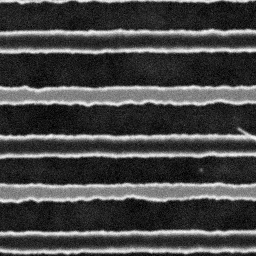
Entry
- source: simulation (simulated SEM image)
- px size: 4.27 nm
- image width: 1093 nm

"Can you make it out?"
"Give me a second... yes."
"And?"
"lines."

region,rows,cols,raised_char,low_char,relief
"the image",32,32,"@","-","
--------------------------------
--------------------------------
--------------------------------
--------------------------------
@@@@@@@@@@@@@@@@@@@@@@@@@@@@@@@@
@@@@@@@@@@@@@@@@@@@@@@@@@@@@@@@@
-@-------@@@@-------------------
--------------------------------
--------------------------------
--------------------------------
--------------------------------
@@@@@@@@@@@@@@@@@@@@@@@@@@@@@@@@
@@@@@@@@@@@@@@@@@@@@@@@@@@@@@@@@
--------------------------------
--------------------------------
--------------------------------
--------------------------------
@@@@@@@@@@@@@@@@@@@@@@@@@@@@@@@@
@@@@@@@@@@@@@@@@@@@@@@@@@@@@@@@@
@@@@@@-@@-----@@--@-----@-------
--------------------------------
--------------------------------
--------------------------------
@@@@@@@@@@@@@@@@@@@@@@@@@@@@@@@@
@@@@@@@@@@@@@@@@@@@@@@@@@@@@@@@@
--------------------------------
--------------------------------
--------------------------------
--------------------------------
@@@@@@@@@@@@@@@@@@@@@@@@@@@@@@@@
@@@@@@@@@@@@@@@@@@@@@@@@@@@@@@@@
@@@@@@@@@@@@@@@@------@@--@-----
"